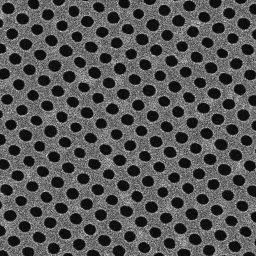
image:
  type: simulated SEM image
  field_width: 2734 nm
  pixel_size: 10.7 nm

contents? a regular array of holes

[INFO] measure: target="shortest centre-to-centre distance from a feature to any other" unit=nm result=190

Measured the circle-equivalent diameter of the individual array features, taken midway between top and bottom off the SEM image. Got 123 nm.